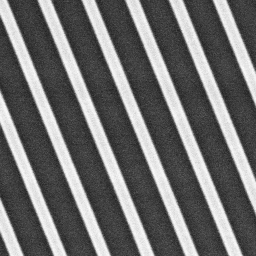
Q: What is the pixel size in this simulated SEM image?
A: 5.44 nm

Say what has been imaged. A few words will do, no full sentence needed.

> parallel lines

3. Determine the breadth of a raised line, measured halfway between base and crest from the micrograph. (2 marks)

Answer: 59.3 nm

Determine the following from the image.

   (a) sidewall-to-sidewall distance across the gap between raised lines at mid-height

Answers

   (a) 160 nanometres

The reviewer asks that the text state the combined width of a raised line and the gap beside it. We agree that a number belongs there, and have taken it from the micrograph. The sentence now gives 221 nm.